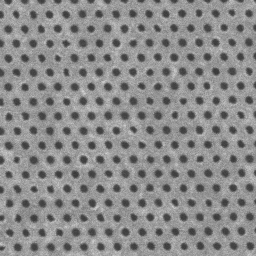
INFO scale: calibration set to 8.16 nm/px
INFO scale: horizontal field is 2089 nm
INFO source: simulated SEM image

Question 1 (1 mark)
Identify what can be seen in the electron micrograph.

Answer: a regular array of holes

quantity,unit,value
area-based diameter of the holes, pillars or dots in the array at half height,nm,70.1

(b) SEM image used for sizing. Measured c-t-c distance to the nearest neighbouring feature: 133 nanometres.